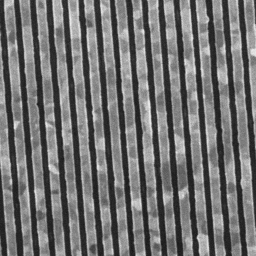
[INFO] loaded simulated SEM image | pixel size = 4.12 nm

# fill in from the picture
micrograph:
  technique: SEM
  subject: parallel lines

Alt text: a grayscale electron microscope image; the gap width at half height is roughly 28.2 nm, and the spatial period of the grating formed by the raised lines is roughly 65.7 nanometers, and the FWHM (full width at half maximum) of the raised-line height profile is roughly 0.0364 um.